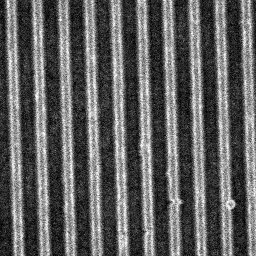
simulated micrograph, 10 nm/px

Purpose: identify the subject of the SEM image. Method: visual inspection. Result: parallel lines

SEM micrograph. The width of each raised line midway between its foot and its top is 0.103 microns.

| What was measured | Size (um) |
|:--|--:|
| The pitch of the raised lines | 0.261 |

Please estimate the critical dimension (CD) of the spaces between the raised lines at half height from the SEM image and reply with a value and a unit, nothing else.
160 nanometres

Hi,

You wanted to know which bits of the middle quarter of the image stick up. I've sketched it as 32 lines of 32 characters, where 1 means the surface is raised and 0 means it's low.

10000011000011100001100001110000
10000011000011100001100001110000
10000011000011100001100001110000
10000011000011100001100001110000
10000011000001100001100001110000
11000011000011100001100001110000
11000011000011100001100001110000
11000011000001100001100000110000
11000011000011100001100000110000
11000011000011100001100000110000
11000011000011100001100000110000
11000011000011100001100000110000
11000011000001100001100000110000
11000011000001100001100000110000
11000011000001100001100000110000
11000011000001100001110000110000
11000011000001100001110000110000
11000011000001100001110000110000
11000011000001100001110000110000
11000011100001100001110000110000
11000011100001100001110000110000
11000011100001100001110000110000
11000011100001100001110000110000
11000011100001100000110000110000
11000011100001100000110000110000
11000011100001100001110000110000
11000011100001100000110000110000
11000011100001110000110000110000
11000011100001100000110000110000
11000011100001100000110000111000
11000001100001100000110000111000
11000001100001100000110000111000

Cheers